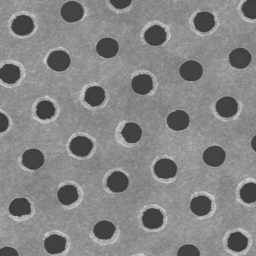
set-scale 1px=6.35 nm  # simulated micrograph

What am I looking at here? a regular array of holes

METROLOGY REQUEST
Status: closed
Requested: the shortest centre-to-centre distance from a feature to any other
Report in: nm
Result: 315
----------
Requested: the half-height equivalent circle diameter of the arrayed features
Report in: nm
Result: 137